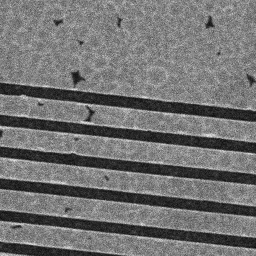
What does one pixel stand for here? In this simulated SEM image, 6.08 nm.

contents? parallel lines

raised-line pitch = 191 nm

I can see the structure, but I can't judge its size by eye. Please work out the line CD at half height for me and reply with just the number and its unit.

123 nm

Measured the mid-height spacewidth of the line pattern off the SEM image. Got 66.4 nm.